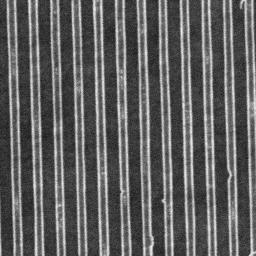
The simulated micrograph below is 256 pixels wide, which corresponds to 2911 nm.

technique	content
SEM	parallel lines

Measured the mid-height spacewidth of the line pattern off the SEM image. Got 160 nanometers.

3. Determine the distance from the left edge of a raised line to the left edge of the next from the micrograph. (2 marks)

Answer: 245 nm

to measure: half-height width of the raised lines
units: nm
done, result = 85.2